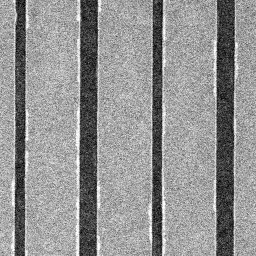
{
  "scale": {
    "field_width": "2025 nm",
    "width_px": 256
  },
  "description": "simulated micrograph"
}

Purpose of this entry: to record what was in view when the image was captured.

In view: one or a few lines or trenches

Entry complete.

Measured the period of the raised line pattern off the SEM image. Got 540 nanometers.